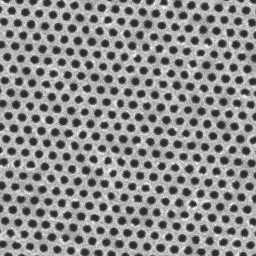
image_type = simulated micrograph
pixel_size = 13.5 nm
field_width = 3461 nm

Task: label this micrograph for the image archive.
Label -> a regular array of holes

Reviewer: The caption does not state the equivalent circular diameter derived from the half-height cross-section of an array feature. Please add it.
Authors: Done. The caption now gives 0.122 microns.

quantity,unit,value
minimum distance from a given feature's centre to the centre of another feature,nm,179